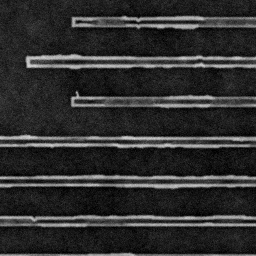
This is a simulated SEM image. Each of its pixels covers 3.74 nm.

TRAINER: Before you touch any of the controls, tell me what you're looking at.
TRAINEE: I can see parallel lines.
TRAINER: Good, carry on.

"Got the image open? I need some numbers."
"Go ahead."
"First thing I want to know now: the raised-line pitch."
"148 nm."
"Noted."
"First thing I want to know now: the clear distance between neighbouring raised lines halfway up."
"108 nanometres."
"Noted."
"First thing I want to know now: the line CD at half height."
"10.7 pixels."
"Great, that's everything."